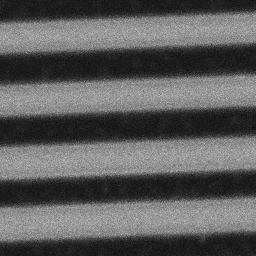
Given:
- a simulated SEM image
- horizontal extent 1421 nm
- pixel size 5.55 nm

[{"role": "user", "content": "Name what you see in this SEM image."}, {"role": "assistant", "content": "one or a few lines or trenches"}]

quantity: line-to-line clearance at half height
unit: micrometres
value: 0.148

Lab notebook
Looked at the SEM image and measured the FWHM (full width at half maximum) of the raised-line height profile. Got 198 nm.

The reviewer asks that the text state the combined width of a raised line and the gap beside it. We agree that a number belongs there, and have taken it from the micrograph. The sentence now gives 345 nanometres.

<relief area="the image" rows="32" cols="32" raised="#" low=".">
################################
################################
################................
................................
................................
.......................#########
################################
################################
################################
################################
##########......................
................................
................................
...................#############
################################
################################
################################
############################....
####............................
................................
................................
................################
################################
################################
################################
###################.............
................................
................................
................................
.........#######################
################################
################################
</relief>